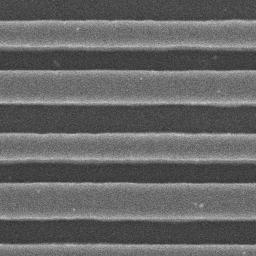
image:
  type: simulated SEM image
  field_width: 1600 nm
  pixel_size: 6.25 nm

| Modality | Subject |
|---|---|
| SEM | lines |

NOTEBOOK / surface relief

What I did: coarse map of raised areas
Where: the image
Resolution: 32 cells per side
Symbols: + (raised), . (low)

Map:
................................
................................
................................
++++++++++++++++++++++++++++++++
++++++++++++++++++++++++++++++++
++++++++++++++++++++++++++++++++
................................
................................
................................
++++++++++++++++++++++++++++++++
++++++++++++++++++++++++++++++++
++++++++++++++++++++++++++++++++
++++++++++++++++++++++++++++++++
................................
................................
................................
................................
++++++++++++++++++++++++++++++++
++++++++++++++++++++++++++++++++
++++++++++++++++++++++++++++++++
................................
................................
................................
++++++++++++++++++++++++++++++++
++++++++++++++++++++++++++++++++
++++++++++++++++++++++++++++++++
++++++++++++++++++++++++++++++++
................................
................................
................................
................................
++++++++++++++++++++++++++++++++